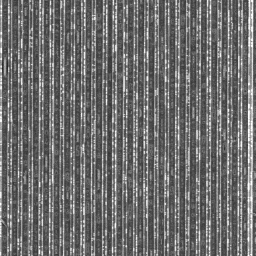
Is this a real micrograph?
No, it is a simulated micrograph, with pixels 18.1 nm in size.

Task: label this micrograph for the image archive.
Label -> parallel lines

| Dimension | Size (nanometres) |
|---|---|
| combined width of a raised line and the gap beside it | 189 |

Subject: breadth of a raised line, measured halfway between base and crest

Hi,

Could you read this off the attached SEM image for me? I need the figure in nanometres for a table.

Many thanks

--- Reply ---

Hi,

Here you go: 67.8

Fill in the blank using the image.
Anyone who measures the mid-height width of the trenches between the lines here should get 118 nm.